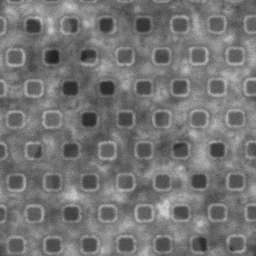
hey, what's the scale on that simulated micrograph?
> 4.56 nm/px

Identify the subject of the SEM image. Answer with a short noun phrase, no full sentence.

a regular array of raised bodies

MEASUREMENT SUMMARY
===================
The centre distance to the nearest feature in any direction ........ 0.165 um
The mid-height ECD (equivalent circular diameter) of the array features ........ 0.0859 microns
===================